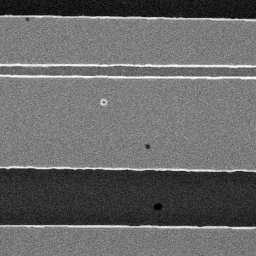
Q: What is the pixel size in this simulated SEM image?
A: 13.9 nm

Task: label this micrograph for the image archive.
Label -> lines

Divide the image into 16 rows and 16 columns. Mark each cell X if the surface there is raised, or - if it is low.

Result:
----------------
XXXXXXXXXXXXXXXX
XXXXXXXXXXXXXXXX
XXXXXXXXXXXXXXXX
XXXXXXXXXXXXXXXX
XXXXXXXXXXXXXXXX
XXXXXXXXXXXXXXXX
XXXXXXXXXXXXXXXX
XXXXXXXXXXXXXXXX
XXXXXXXXXXXXXXXX
--XXXXXXXXXXXXXX
----------------
----------------
----------------
XXXXXXXXXXXXXXXX
XXXXXXXXXXXXXXXX